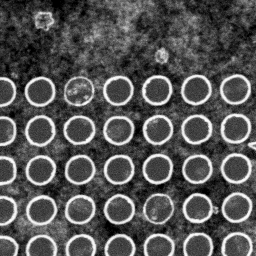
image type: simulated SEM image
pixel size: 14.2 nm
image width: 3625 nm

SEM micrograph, a regular array of raised bodies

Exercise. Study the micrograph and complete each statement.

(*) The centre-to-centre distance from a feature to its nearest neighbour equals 553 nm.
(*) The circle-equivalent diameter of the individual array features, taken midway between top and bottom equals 28.1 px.